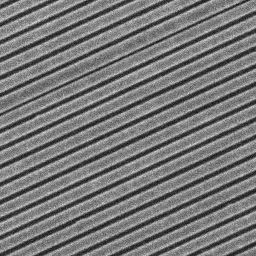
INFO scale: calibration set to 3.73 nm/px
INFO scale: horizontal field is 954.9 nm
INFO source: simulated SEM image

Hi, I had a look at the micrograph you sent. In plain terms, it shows parallel lines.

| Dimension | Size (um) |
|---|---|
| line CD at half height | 0.0398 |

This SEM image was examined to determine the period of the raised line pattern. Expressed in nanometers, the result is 60.1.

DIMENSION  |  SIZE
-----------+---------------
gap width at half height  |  19.9 nm